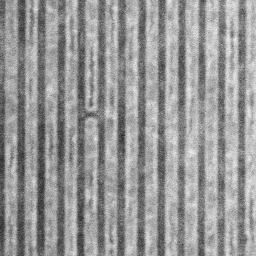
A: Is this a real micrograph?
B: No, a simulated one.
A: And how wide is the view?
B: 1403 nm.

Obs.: parallel lines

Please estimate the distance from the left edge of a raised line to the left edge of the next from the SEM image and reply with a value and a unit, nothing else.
110 nanometers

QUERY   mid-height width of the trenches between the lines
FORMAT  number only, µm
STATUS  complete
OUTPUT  0.0479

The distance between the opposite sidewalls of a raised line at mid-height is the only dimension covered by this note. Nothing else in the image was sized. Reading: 62.3 nm